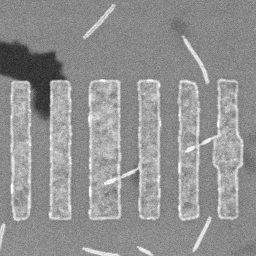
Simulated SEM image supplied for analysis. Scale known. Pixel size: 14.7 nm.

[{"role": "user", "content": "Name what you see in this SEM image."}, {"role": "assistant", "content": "wiring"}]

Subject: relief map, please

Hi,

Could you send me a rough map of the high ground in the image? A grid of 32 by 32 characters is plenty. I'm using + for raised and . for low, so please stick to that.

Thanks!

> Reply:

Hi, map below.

................................
................................
................................
................................
................................
................................
................................
................................
................................
................................
..+...+++..++++..+++...+...+++..
..++..+++..++++..+++..+++..+++..
..++..+++..++++...++..+++..+++..
..++..+++..++++...++..+++..+++..
..++..+++..++++...++...++..+++..
.+++..+++..++++...++...++..+++..
..++..+++..++++..+++..+++..+++..
..++..+++..++++..+++..+++..+++..
..++..+++..++++...++..+++..+++..
..++..+++..++++...++..+++..+++..
..++..+++..++++..+++...++..+++..
..++..+++..++++..+++...++..+++..
..++..+++..++++...++..+++..+++..
..++..+++..++++...++..+++..+++..
..++..+++..++++...++..+++..+++..
..++..+++..++++...++..+++..+++..
..++..+++..++++...++...++..+++..
................................
................................
................................
................................
................................